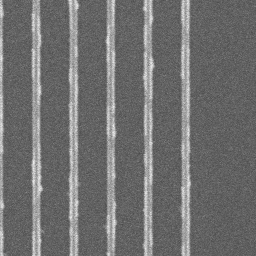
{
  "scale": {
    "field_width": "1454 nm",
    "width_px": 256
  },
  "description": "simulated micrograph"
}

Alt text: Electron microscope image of parallel lines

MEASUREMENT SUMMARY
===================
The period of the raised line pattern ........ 37.4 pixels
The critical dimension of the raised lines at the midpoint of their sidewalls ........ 41.9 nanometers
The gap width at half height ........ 170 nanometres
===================